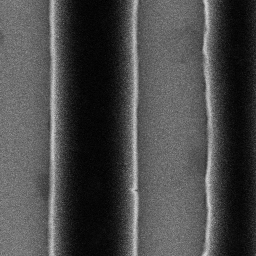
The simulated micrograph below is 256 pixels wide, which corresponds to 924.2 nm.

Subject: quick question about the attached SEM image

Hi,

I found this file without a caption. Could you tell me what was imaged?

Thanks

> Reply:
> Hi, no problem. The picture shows one or a few lines or trenches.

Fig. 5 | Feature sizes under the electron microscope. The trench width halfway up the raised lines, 254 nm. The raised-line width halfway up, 306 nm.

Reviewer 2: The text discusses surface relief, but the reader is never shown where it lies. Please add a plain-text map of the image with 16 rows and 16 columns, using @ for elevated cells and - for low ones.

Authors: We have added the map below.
---@@@@@@----@@@
---@@@@@-----@@@
---@@@@@-----@@@
---@@@@@-----@@@
---@@@@@@----@@@
---@@@@@-----@@@
---@@@@@-----@@@
---@@@@@-----@@@
---@@@@@-----@@@
---@@@@@-----@@@
---@@@@@-----@@@
---@@@@@-----@@@
---@@@@@@----@@@
---@@@@@@----@@@
---@@@@@-----@@@
---@@@@@-----@@@